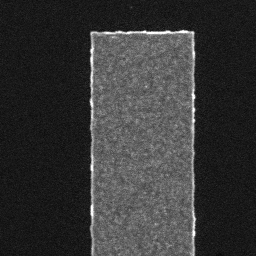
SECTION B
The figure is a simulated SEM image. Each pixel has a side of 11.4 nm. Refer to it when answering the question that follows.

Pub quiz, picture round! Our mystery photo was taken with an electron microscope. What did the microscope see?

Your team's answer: one or a few lines or trenches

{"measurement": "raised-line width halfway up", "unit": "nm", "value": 1180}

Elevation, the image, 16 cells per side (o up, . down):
................
................
......oooooo....
......oooooo....
......oooooo....
......oooooo....
......oooooo....
......oooooo....
......oooooo....
......oooooo....
......oooooo....
......oooooo....
......oooooo....
......oooooo....
......oooooo....
......oooooo....